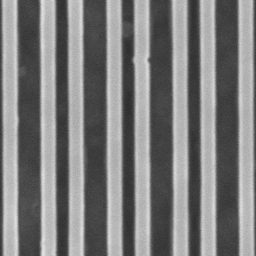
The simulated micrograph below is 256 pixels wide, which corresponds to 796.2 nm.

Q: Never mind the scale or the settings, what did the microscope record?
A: parallel lines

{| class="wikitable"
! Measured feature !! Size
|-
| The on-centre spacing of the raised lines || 105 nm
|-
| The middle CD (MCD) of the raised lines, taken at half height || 42.7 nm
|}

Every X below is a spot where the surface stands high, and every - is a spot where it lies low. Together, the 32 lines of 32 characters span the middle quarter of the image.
-XXX-------XXX----XXX-------XXX-
-XXX-------XXX----XXX-------XXX-
-XXX-------XXX----XXX-------XXX-
-XXX-------XXX----XXX-------XXX-
-XXX-------XXX----XXX-------XXX-
-XXX-------XXX----XXX-------XXX-
-XXX-------XXX----XXX-------XXX-
-XXX-------XXX----XXX-------XXX-
-XXX-------XXX----XXX-------XXX-
-XXX-------XXX----XXX-------XXX-
-XXX-------XXX----XXX-------XXX-
-XXX-------XXX----XXX-------XXX-
-XXX-------XXX----XXX-------XXX-
-XXX-------XXX----XXX-------XXX-
-XXX-------XXX----XXX-------XXX-
-XXX-------XXX----XXX-------XXX-
-XXX-------XXX----XXX-------XXX-
--XXX------XXX----XXX-------XXX-
--XXX------XXX----XXX-------XXX-
--XXX------XXX----XXX-------XXX-
--XXX------XXX----XXX-------XXX-
--XXX------XXX----XXX-------XXX-
--XXX------XXX----XXX-------XXX-
--XXX------XXX----XXX-------XXX-
--XXX------XXX----XXX-------XXX-
--XXX------XXX----XXX-------XXX-
--XXX------XXX----XXX-------XXX-
--XXX------XXX----XXX-------XXX-
--XXX------XXX----XXX-------XXX-
--XXX------XXX----XXX-------XXX-
--XXX------XXX----XXX-------XXX-
--XXX------XXX----XXX-------XXX-